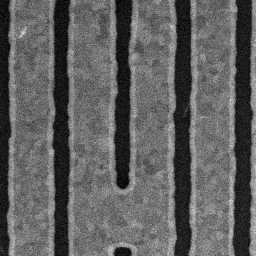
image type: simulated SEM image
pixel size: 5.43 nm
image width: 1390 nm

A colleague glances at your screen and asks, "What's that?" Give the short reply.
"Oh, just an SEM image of parallel lines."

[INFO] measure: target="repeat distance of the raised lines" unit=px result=60.4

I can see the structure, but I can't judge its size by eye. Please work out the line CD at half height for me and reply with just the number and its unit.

0.218 um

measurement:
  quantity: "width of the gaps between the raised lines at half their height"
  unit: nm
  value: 111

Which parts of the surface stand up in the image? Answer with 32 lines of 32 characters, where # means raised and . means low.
..#####..#####...####...#####...
..####...#####...#####..#####...
..####...#####...#####..#####...
.#####...#####...#####..#####...
.######..#####...#####..#####...
..#####..#####..######..#####...
..#####..#####..######..#####...
.######..#####..#####...#####...
.#####...#####...####...#####...
.#####...#####...####...#####...
.#####...#####...####...#####...
.#####...#####...#####..#####...
.#####...#####...#####..#####...
..####...#####...#####..#####...
..####...#####...####...#####...
..####...#####...####...#####...
..####...#####...#####..#####...
.#####...#####...####...#####...
.#####...#####...####...#####...
.#####...#####...####...#####...
.#####...#####...####...#####...
.#####...#####...####...#####...
.#####...#####..#####...#####...
.#####...######.#####...#####...
.#####...############...#####...
.#####...############...#####...
.#####...############...#####...
.#####...############...#####...
.######..#############..#####...
..####...#############..#####...
..####...############...#####...
..####...#####...####...#####...